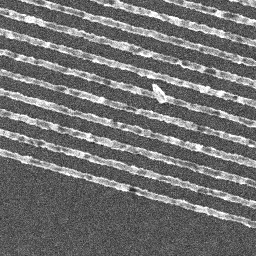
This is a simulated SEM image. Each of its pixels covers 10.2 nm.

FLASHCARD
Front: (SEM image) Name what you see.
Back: parallel lines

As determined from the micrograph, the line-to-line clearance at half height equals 137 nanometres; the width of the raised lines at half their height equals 59.9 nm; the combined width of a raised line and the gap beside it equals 197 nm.